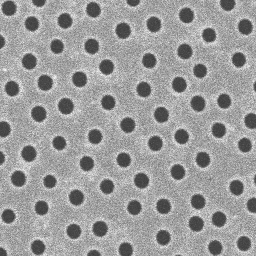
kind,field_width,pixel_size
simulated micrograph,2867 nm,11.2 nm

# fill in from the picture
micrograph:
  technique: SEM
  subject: a regular array of holes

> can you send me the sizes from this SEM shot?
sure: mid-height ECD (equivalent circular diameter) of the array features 176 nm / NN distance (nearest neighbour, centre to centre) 314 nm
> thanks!